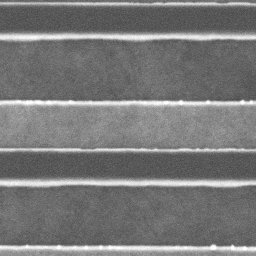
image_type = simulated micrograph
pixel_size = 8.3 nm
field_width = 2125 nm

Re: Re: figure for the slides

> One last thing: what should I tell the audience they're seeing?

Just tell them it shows lines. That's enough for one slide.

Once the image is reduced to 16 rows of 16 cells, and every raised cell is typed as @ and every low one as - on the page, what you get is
@@@@@@@@@@@@@@@@
@@@@@@@@@@@@@@@@
----------------
----------------
----------------
----------------
@@@@@@@@@@@@@@@@
@@@@@@@@@@@@@@@@
@@@@@@@@@@@@@@@@
@@@@@@@@@@@@@@@@
@@@@@@@@@@@@@@@@
----------------
----------------
----------------
----------------
@@@@@@@@---@-@@-